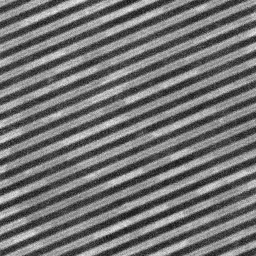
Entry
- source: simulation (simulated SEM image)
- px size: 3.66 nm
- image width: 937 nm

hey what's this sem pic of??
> parallel lines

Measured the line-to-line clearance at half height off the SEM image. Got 8.61 pixels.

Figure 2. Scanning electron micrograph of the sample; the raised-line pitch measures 0.0512 µm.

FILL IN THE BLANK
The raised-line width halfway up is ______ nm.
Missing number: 17.7